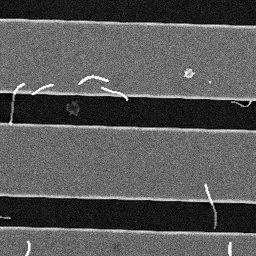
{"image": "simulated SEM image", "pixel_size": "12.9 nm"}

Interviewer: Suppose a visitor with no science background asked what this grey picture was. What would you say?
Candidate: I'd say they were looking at lines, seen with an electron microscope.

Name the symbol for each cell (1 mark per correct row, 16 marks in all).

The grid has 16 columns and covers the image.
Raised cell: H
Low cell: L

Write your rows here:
LLLLLLLLLLLLLLLL
HHHHHHHHHHLLLLLL
HHHHHHHHHHHHHHHH
HHHHHHHHHHHHHHHH
HHHHHHHHHHHHHHHH
HHHHHHHHHHHHHHHH
LLLLLLLLLLLLLLLL
LLLLLLLLLLLLLLLL
HHHHHHHHHHHHHHHH
HHHHHHHHHHHHHHHH
HHHHHHHHHHHHHHHH
HHHHHHHHHHHHHHHH
LLLLLLLLLHHHHHHH
LLLLLLLLLLLLLLLL
HHHHHHHHHHLLLLLL
HHHHHHHHHHHHHHHH